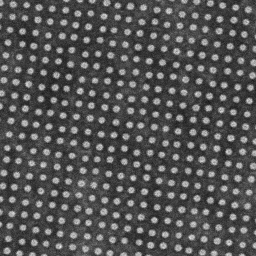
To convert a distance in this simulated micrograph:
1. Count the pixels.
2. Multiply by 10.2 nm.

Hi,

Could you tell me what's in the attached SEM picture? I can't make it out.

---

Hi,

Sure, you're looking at a regular array of raised bodies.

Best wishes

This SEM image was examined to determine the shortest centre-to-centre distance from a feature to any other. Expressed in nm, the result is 124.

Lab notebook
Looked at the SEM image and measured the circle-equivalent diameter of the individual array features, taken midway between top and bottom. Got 61 nm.